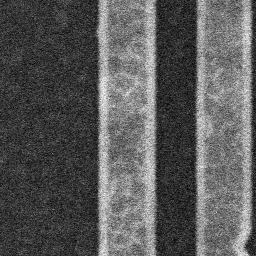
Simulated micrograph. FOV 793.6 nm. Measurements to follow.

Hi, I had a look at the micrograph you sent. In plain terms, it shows one or a few lines or trenches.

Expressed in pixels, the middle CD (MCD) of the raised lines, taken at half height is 47.1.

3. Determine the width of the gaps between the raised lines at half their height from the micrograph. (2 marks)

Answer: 153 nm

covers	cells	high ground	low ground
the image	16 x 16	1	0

0000001110000110
0000001110000110
0000001110000110
0000001110000110
0000001110000110
0000001110000110
0000001110000110
0000001110000110
0000001110000110
0000001110000110
0000001110000110
0000001110000110
0000001110000110
0000001110000110
0000001110000110
0000001110000110